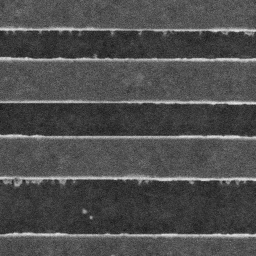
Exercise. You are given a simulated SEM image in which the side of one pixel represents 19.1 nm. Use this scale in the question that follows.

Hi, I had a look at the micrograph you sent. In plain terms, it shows lines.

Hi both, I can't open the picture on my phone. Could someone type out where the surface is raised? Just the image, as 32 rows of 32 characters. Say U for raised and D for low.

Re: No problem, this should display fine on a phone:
UUUUUUUUUUUUUUUUUUUUUUUUUUUUUUUU
UUUUUUUUUUUUUUUUUUUUUUUUUUUUUUUU
UUUUUUUUUUUUUUUUUUUUUUUUUUUUUUUU
UUUUUUUUUUUUUUUUUUUUUUUUUUUUUUUU
DDDDDDDDDDDDDDDDDDDDDDDDDDDDDDDD
DDDDDDDDDDDDDDDDDDDDDDDDDDDDDDDD
DDDDDDDDDDDDDDDDDDDDDDDDDDDDDDDD
UUUUUUUUUUUUUUUUUUUUUUUUUUUUUUUU
UUUUUUUUUUUUUUUUUUUUUUUUUUUUUUUU
UUUUUUUUUUUUUUUUUUUUUUUUUUUUUUUU
UUUUUUUUUUUUUUUUUUUUUUUUUUUUUUUU
UUUUUUUUUUUUUUUUUUUUUUUUUUUUUUUU
UUUUUUUUUUUUUUUUUUUUUUUUUUUUUUUU
DDDDDDDDDDDDDDDDDDDDDDDDDDDDDDDD
DDDDDDDDDDDDDDDDDDDDDDDDDDDDDDDD
DDDDDDDDDDDDDDDDDDDDDDDDDDDDDDDD
DDDDDDDDDDDDDDDDDDDDDDDDDDDDDDDD
UUUUUUUUUUUUUUUUUUUUUUUUUUUUUUUU
UUUUUUUUUUUUUUUUUUUUUUUUUUUUUUUU
UUUUUUUUUUUUUUUUUUUUUUUUUUUUUUUU
UUUUUUUUUUUUUUUUUUUUUUUUUUUUUUUU
UUUUUUUUUUUUUUUUUUUUUUUUUUUUUUUU
DDUDDDDDDDDDDDDDDDDDDDDDDDDDDDDD
DDDDDDDDDDDDDDDDDDDDDDDDDDDDDDDD
DDDDDDDDDDDDDDDDDDDDDDDDDDDDDDDD
DDDDDDDDDDDDDDDDDDDDDDDDDDDDDDDD
DDDDDDDDDDDDDDDDDDDDDDDDDDDDDDDD
DDDDDDDDDDDDDDDDDDDDDDDDDDDDDDDD
DDDDDDDDDDDDDDDDDDDDDDDDDDDDDDDD
UUUUUUUUUUUUUUUUUUUUUUUUUUUUUUDD
UUUUUUUUUUUUUUUUUUUUUUUUUUUUUUUU
UUUUUUUUUUUUUUUUUUUUUUUUUUUUUUUU